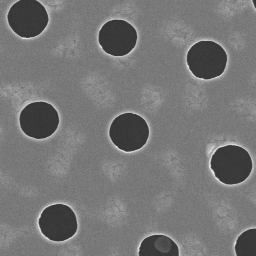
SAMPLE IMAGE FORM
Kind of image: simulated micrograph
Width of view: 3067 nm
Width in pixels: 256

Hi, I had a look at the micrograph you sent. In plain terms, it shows holes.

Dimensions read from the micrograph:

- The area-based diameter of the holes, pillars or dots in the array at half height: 464 nm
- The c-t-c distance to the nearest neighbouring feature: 1100 nanometers